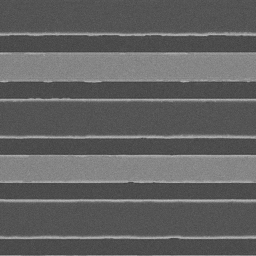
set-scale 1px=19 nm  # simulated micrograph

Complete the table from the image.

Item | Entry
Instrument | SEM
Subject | lines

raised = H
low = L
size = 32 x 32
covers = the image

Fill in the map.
HHHHHHHHHHHHHHHHHHHHHHHHHHHHHHHH
HHHHHHHHHHHHHHHHHHHHHHHHHHHHHHHH
HHHHHHHHHHHHHHHHHHHHHHHHHHHHHHHH
HHHHHHHHHHHHHHHHHHHHHHHHHHHHHHHH
LLLLLLLLLLLLLLLLLLLLLLLLLLLLLLLL
LLLLLLLLLLLLLLLLLLLLLLLLLLLLLLLL
LLLLLLLLLLLLLLLLLLLLLLLLLLLLLLLL
HHHHHHHHHHHHHHHHHHHHHHHHHHHHHHHH
HHHHHHHHHHHHHHHHHHHHHHHHHHHHHHHH
HHHHHHHHHHHHHHHHHHHHHHHHHHHHHHHH
LLLLLLLLLLLLLLLLLLLLLLLLLLLLLLLL
LLLLLLLLLLLLLLLLLLLLLLLLLLLLLLLL
HHHHHHHHHHHHLLLHHHHHHHHHHHHHHHHH
HHHHHHHHHHHHHHHHHHHHHHHHHHHHHHHH
HHHHHHHHHHHHHHHHHHHHHHHHHHHHHHHH
HHHHHHHHHHHHHHHHHHHHHHHHHHHHHHHH
HHHHHHHHHHHHHHHHHHHHHHHHHHHHHHHH
LLLLLLLLLLLLLLLLLLLLLLLLLLLLLLLL
LLLLLLLLLLLLLLLLLLLLLLLLLLLLLLLL
HHLHHHHHHHHHHHHHLHHLLLHHHHLLLLHH
HHHHHHHHHHHHHHHHHHHHHHHHHHHHHHHH
HHHHHHHHHHHHHHHHHHHHHHHHHHHHHHHH
HHHHHHHHHHHHHHHHHHHHHHHHHHHHHHHH
LLLLLLLLLLLLLLLLLLLLLLLLLLLLLLLL
LLLLLLLLLLLLLLLLLLLLLLLLLLLLLLLL
HHHHHHHHHHHHHHHHHHHHHHHHHHHHHHHH
HHHHHHHHHHHHHHHHHHHHHHHHHHHHHHHH
HHHHHHHHHHHHHHHHHHHHHHHHHHHHHHHH
HHHHHHHHHHHHHHHHHHHHHHHHHHHHHHHH
HHHHHHHHHHHHHHHHHHHHHHHHHHHHHHHH
LLLLLLLLLLLLLLLLLLLLLLLLLLLLLLLL
LLLLLLLLLLLLLLLLLLLLLLLLLLLLLLLL